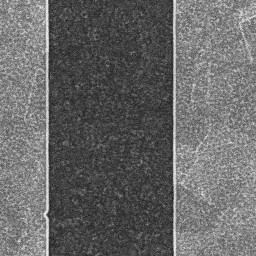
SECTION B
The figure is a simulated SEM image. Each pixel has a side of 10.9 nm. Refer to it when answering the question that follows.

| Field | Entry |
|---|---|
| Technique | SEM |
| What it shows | one or a few lines or trenches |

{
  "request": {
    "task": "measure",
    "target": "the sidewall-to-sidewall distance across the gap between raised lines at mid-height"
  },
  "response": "1390 nm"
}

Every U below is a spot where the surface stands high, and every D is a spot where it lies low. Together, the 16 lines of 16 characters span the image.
UUUDDDDDDDDUUUUU
UUUDDDDDDDDUUUUU
UUUDDDDDDDDUUUUU
UUUDDDDDDDDUUUUU
UUUDDDDDDDDUUUUU
UUUDDDDDDDDUUUUU
UUUDDDDDDDDUUUUU
UUUDDDDDDDDUUUUU
UUUDDDDDDDDUUUUU
UUUDDDDDDDDUUUUU
UUUDDDDDDDDUUUUU
UUUDDDDDDDDUUUUU
UUUDDDDDDDDUUUUU
UUUDDDDDDDDUUUUU
UUUDDDDDDDDUUUUU
UUUDDDDDDDDUUUUU